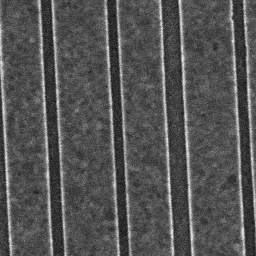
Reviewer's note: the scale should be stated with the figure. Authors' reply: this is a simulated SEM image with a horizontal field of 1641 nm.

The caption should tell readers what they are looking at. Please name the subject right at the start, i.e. one or a few lines or trenches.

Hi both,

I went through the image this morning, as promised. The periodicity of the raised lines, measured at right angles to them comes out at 400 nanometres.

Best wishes